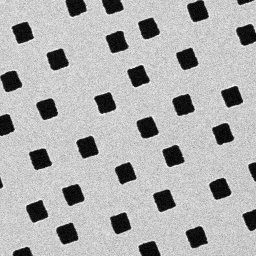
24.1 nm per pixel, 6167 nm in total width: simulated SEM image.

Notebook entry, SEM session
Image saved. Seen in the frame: a regular array of holes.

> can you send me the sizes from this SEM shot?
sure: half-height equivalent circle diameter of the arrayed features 0.516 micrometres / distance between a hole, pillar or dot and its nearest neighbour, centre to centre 1.02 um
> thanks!